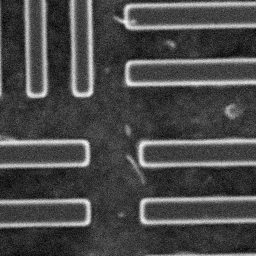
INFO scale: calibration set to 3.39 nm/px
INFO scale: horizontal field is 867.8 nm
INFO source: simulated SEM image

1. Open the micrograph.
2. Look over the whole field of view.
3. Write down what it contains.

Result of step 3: groups of lines, slits or small figures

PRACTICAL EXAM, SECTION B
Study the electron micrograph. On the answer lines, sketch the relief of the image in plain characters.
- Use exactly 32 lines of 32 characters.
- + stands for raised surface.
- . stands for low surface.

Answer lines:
...+++...++.................++++
...+++...++.....++++++++++++++++
...+++...++.....++++++++++++++++
...+++...++.....................
...+++...++.....................
...+++...++.....................
...+++...++.....................
...+++...++...................++
...+++...++.....++++++++++++++++
...+++...++.....++++++++++++++++
...+++...++.....+++++++++.......
....++...++.....................
................................
................................
................................
................................
................................
................................
+++++++++++.......++++++++++++++
+++++++++++.......++++++++++++++
+++++++++++.......+++++++++++...
................................
................................
................................
................................
+++++++++++.......++++++++++++++
+++++++++++.......++++++++++++++
+++++++++++.......++++++++++++++
................................
................................
................................
................................